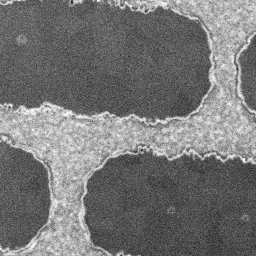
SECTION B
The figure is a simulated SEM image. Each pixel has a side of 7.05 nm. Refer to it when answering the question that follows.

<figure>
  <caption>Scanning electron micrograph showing one or a few lines or trenches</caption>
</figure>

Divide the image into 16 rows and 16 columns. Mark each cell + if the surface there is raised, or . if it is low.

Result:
++++++++..+.....
+++++++++++++...
+++++++++++++...
+++++++++++++..+
+++++++++++++..+
+++++++++++++..+
+++++++++++++..+
.........++.....
................
++......++......
+++...++++++++++
+++..+++++++++++
+++..+++++++++++
+++..+++++++++++
++...+++++++++++
+.....++++++++++